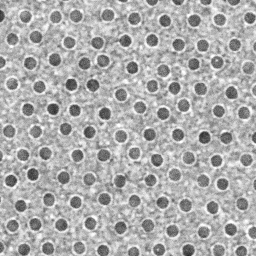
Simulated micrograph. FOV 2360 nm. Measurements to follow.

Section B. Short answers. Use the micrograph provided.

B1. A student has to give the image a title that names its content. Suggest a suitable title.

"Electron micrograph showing a regular array of holes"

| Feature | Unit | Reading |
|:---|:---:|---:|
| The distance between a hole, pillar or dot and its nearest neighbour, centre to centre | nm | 213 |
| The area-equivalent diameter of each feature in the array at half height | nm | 124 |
